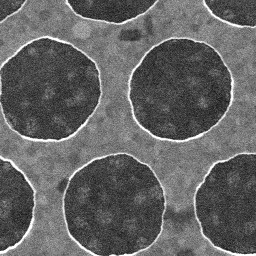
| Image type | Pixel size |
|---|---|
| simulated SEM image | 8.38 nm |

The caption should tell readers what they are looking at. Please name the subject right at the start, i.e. holes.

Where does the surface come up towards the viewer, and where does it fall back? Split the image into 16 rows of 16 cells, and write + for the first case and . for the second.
.+++.....++++...
+++++++++++++++.
++.+++++++..++++
+....++++.....++
......++......++
......++......++
......++......++
.....++++.....++
++..++++++..++++
++++++++++++++++
.++++....++++...
..++......+++...
..++......++....
..++......++....
..++......+++...
.++++....+++++..